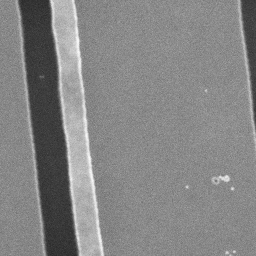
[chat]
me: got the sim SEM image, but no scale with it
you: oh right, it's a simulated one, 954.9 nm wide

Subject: lines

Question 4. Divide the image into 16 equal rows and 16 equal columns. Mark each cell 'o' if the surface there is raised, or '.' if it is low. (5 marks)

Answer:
o..oooooooooooo.
o..oooooooooooo.
o..oooooooooooo.
o...ooooooooooo.
oo..oooooooooooo
oo..oooooooooooo
oo..oooooooooooo
oo..oooooooooooo
oo..oooooooooooo
oo..oooooooooooo
oo..oooooooooooo
oo..oooooooooooo
oo..oooooooooooo
ooo..ooooooooooo
ooo..ooooooooooo
ooo..ooooooooooo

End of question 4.